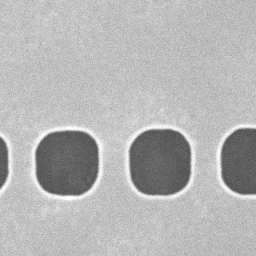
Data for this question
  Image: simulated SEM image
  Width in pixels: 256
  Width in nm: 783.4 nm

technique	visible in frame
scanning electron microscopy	holes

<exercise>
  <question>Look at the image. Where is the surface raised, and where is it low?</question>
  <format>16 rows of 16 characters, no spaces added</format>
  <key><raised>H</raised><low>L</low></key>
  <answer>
HHHHHHHHHHHHHHHH
HHHHHHHHHHHHHHHH
HHHHHHHHHHHHHHHH
HHHHHHHHHHHHHHHH
HHHHHHHHHHHHHHHH
HHHHHHHHHHHHHHHH
HHHHHHHHHHHHHHHH
HHHHHHHHHHHHHHHH
HHHLLLHHHLLHHHLL
LHLLLLHHLLLLHHLL
LHLLLLHHLLLLHHLL
HHLLLLHHLLLLHHLL
HHHHHHHHHHHHHHHH
HHHHHHHHHHHHHHHH
HHHHHHHHHHHHHHHH
HHHHHHHHHHHHHHHH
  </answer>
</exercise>